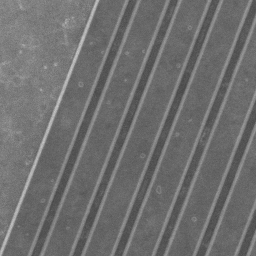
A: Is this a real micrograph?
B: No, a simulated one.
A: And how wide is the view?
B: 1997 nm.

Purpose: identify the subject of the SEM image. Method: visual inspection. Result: parallel lines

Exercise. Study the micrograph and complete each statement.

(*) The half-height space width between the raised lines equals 79.3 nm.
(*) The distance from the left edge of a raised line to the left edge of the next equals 301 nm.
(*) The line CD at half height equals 28.1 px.